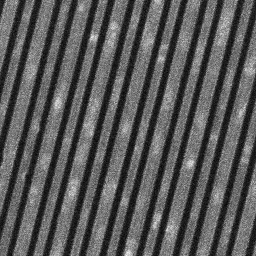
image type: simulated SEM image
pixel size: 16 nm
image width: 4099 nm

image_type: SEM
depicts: parallel lines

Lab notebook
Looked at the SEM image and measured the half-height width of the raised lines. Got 0.153 micrometres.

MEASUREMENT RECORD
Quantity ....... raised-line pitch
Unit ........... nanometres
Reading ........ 282